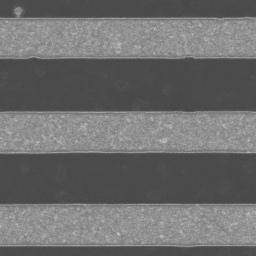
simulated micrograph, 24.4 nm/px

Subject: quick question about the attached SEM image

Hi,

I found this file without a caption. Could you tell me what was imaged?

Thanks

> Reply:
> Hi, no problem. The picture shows one or a few lines or trenches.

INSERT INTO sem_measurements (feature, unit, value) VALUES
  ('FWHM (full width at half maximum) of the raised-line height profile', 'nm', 1310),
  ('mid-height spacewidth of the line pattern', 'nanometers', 965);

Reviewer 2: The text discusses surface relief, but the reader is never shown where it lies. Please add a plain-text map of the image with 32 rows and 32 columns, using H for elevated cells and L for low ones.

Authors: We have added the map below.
HHHHHHHHHHHHHHHHHHHHHHHHHHHHHHHH
HHLHHHHHHHHHHHHHHHHHHHHHHHHHHHHH
LLLLLLLLLLLLLLLLLLLLLLLLLLLLLLLL
LLLLLLLLLLLLLLLLLLLLLLLLLLLLLLLL
LLLLLLLLLLLLLLLLLLLLLLLLLLLLLLLL
LLLLLLLLLLLLLLLLLLLLLLLLLLLLLLLL
LLLLLLLLLLLLLLLLLLLLLLLLLLLLLLLL
HHHHHHHHHHHHHHHHHHHHHHHHHHHHHHHH
HHHHHHHHHHHHHHHHHHHHHHHHHHHHHHHH
HHHHHHHHHHHHHHHHHHHHHHHHHHHHHHHH
HHHHHHHHHHHHHHHHHHHHHHHHHHHHHHHH
HHHHHHHHHHHHHHHHHHHHHHHHHHHHHHHH
HHHHHHHHHHHHHHHHHHHHHHHHHHHHHHHH
HHHHHHHHHHHHHHHHHHHHHHHHHHHHHHHH
LLLLLLLLLLLLLLLLLLLLLLLLLLLLLLLL
LLLLLLLLLLLLLLLLLLLLLLLLLLLLLLLL
LLLLLLLLLLLLLLLLLLLLLLLLLLLLLLLL
LLLLLLLLLLLLLLLLLLLLLLLLLLLLLLLL
LLLLLLLLLLLLLLLLLLLLLLLLLLLLLLLL
HHHHHHHHHHHHHHHHHHHHHHHHHHHHHHHH
HHHHHHHHHHHHHHHHHHHHHHHHHHHHHHHH
HHHHHHHHHHHHHHHHHHHHHHHHHHHHHHHH
HHHHHHHHHHHHHHHHHHHHHHHHHHHHHHHH
HHHHHHHHHHHHHHHHHHHHHHHHHHHHHHHH
HHHHHHHHHHHHHHHHHHHHHHHHHHHHHHHH
HHHHHHHHHHHHHHHHHHHHHHHHHHHHHHHH
LLLLLLLLLLLLLLLLLLLLLLLLLLLLLLLL
LLLLLLLLLLLLLLLLLLLLLLLLLLLLLLLL
LLLLLLLLLLLLLLLLLLLLLLLLLLLLLLLL
LLLLLLLLLLLLLLLLLLLLLLLLLLLLLLLL
LLLLLLLLLLLLLLLLLLLLLLLLLLLLLLLL
HHHHHHHHHHHHHHHHHHHHHHHHHHHHHHHH